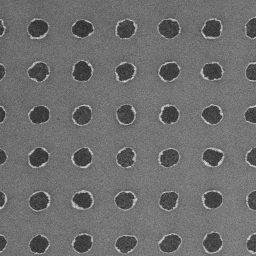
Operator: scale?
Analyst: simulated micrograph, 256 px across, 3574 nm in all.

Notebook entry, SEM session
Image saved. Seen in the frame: a regular array of raised bodies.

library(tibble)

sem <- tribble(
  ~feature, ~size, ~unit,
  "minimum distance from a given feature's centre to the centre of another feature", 595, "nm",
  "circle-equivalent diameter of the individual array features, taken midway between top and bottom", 0.282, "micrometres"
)